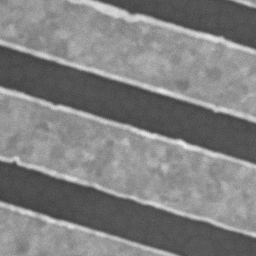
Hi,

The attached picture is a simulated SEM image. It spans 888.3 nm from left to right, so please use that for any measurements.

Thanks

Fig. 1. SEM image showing one or a few lines or trenches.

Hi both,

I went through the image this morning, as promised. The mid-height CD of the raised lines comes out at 230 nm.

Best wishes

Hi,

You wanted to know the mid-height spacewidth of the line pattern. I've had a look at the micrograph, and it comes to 151 nm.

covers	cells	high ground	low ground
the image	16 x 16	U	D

UUUUUUUDDDDDDDDD
UUUUUUUUUUDDDDDD
UUUUUUUUUUUUUUDD
DDDUUUUUUUUUUUUU
DDDDDDUUUUUUUUUU
DDDDDDDDDUUUUUUU
UUUDDDDDDDDDDUUU
UUUUUUDDDDDDDDDD
UUUUUUUUUUDDDDDD
UUUUUUUUUUUUUDDD
DDUUUUUUUUUUUUUU
DDDDDUUUUUUUUUUU
DDDDDDDDDUUUUUUU
UUUDDDDDDDDDUUUU
UUUUUUDDDDDDDDDU
UUUUUUUUUDDDDDDD